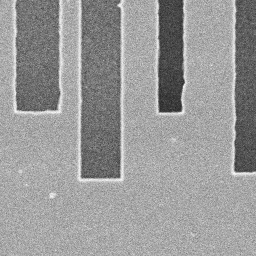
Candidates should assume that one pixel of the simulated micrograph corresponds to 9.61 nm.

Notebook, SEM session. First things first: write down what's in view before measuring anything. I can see one or a few lines or trenches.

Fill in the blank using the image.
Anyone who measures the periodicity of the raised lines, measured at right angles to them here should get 0.668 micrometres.